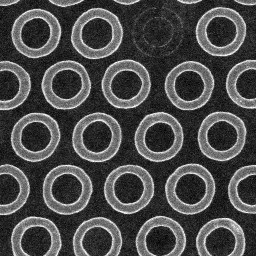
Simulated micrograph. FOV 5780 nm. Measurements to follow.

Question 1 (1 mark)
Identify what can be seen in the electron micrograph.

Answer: a regular array of ring-shaped raised bodies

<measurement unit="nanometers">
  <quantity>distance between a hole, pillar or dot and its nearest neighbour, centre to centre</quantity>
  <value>1350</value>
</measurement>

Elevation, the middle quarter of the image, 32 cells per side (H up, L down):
HHHHLLLLLLLLHHHHHHHHLLLLLLLLHHHH
LLHHHLLLLLLHHHHLLHHHHLLLLLLHHHHH
LLLLHHLLLLHHHLLLLLHHHLLLLLHHHLLL
LLLLHHLLLLHHLLLLLLLHHLLLLLHHLLLL
LLLLHHHLLLHHLLLLLLLLHLLLLLHHLLLL
LLLLLHHLLLHLLLLLLLLHHLLLLHHLLLLL
LLLLHHLLLLHHLLLLLLLHHLLLLHHHLLLL
LLLHHHLLLLHHLLLLLLLHHLLLLLHHLLLL
LLHHHHLLLLLHHLLLLLHHLLLLLLHHHLLL
HHHHHLLLLLLHHHHHHHHLLLLLLLLHHHHH
HHHHLLLLLLLLLHHHHHLLLLLLLLLLHHHH
LLLLLLLLLLLLLLLLLLLLLLLLLLLLLLLL
LLLLLLLHHHHLLLLLLLLLLLHHHHLLLLLL
LLLLLHHHHHHHLLLLLLLLHHHHHHHHLLLL
LLLLHHHLLLHHHLLLLLLHHHHHHHHHLLLL
LLLHHHLLLLLHHHLLLLLHHHLLLLLHHLLL
LLLHHLLLLLLLHHLLLLHHHLLLLLLHHLLL
LLHHLLLLLLLLHHLLLLHHLLLLLLLLHHLL
LLHHHLLLLLLLHHLLLLHHLLLLLLLLHHLL
LLHHHLLLLLLLHHLLLLHHLLLLLLLLHLLL
LLHHHLLLLLLHHHLLLLHHHLLLLLLHHLLL
LLLHHHLLLLHHHLLLLLHHHLLLLLHHHLLL
LLLLHHHHHHHHHLLLLLLHHHHHHHHHLLLL
LLLLLHHHHHHHLLLLLLLLLHHHHHHLLLLL
LLLLLLLLLLLLLLLLLLLLLLLLLLLLLLLL
HHLLLLLLLLLLLLLHHHHLLLLLLLLLLLHH
HHHHHLLLLLLLLHHHHHHHLLLLLLLLHHHH
LLHHHHLLLLLHHHLLLLHHHLLLLLLHHHHL
LLLHHHLLLLLHHLLLLLLHHHLLLLHHHLLL
LLLLHHHLLLHHHLLLLLLLHHLLLLHHLLLL
LLLLLHHLLLHHLLLLLLLLHHLLLHHHLLLL
LLLLLHHLLLHHLLLLLLLLHHLLLHHHLLLL